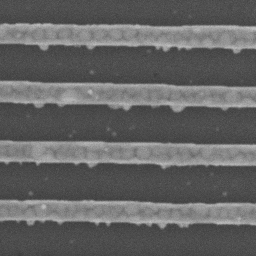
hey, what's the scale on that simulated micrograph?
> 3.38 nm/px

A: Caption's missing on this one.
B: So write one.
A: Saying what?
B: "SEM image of lines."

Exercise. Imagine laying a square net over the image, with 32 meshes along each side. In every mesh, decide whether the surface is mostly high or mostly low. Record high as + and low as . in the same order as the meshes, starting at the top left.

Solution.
................................
................................
................................
++++++++++++++++++++++++++++++++
++++++++++++++++++++++++++++++++
.....+.....+++++++++++++++++++++
................................
................................
................................
................................
+++++++++++++...................
++++++++++++++++++++++++++++++++
++++++++++++++++++++++++++++++++
......................+.........
................................
................................
................................
................................
++++++++++++++++++++++++++++++++
++++++++++++++++++++++++++++++++
...........+.......+++++++++++++
................................
................................
................................
................................
+++++++++++++++++++++...++.+++++
++++++++++++++++++++++++++++++++
...++.++++++++++++++++++++++++++
................................
................................
................................
................................